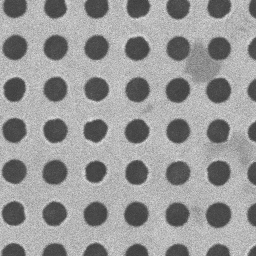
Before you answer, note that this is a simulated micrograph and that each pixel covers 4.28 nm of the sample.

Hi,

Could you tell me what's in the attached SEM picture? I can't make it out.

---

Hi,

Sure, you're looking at a regular array of holes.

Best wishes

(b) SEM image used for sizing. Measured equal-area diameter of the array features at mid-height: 103 nm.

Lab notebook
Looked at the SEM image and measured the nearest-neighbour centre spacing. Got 174 nanometers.